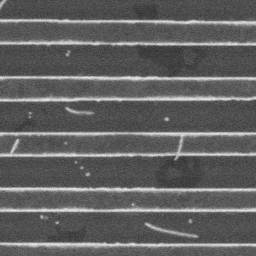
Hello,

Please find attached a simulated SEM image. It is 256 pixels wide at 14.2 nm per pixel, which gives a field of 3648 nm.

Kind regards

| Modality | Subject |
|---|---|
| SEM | lines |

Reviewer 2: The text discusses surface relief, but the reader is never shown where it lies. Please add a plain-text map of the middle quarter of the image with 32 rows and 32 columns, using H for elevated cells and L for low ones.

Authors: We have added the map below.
LLLLLLLLLLLLLLLLLLLLLLLLLLLLLLLL
LLLLLLLLLLLLLLLLLLLLLLLLLLLLLLLL
LLLLLLLLLLLLLLLLLLLLLLLLLLLLLLLL
HHHHLLLLLLLLLLLLLLLLLLLLLLLLLLLL
HHHHHHHHHHHHHHHHHHHHHHHHHHHHHHHH
HHHHHHHHHHHHHHHHHHHHHHHHHHHHHHHH
HHHHHHHHHHHHHHHHHHHHHHHHHHHHHHHH
HHHHHHHHHHHHHHHHHHHHHHHHHHHHHHHH
HHHHHHHHHHHHHHHHHHHHHHHHHHHHHHHH
LLLLLLLLLLLLLLLLLLLLLLLLLLLLLLLL
LLLLLLLLLLLLLLLLLLLLLLLLLLLLLLLL
LLLLLLLLLLLLLLLLLLLLLLLLLLLLLLLL
LLLLLLLLLLLLLLLLLLLLLLLLLLLLLLLL
LLLLLLLLLLLLLLLLLLLLLLLLLLLLLLLL
LLLLLLLLLLLLLLLLLLLLLLLLLLLLLLLL
LLLLLLLLLLLLLLLLLLLLLLLLLLLLLLLL
LLLLLLLLLLLLLLLLLLLLLLLLLLLLLLLL
HHHHHHHHHHHHHHHHHHHHHHLLLLLLHLLL
HHHHHHHHHHHHHHHHHHHHHHHHHHHHHHHH
HHHHHHHHHHHHHHHHHHHHHHHHHHHHHHHH
HHHHHHHHHHHHHHHHHHHHHHHHHHHHHHHH
HHHHHHHHHHHHHHHHHHHHHHHHHHHHHHHH
HHHHHHHHHHHHHHHHHHHHHHHHHHHHHHHH
LLLLLLLLLLLLLLLLLLLLLLLLLLLLLLLL
LLLLLLLLLLLLLLLLLLLLLLLLLLLLLLLL
LLLLLLLLLLLLLLLLLLLLLLLLLLLLLLLL
LLLLLLLLLLLLLLLLLLLLLLLLLLLLLLLL
LLLLLLLLLLLLLLLLLLLLLLLLLLLLLLLL
LLLLLLLLLLLLLLLLLLLLLLLLLLLLLLLL
LLLLLLLLLLLLLLLLLLLLLLLLLLLLLLLL
LLLLLLLLLLLLLLLLLLLLLLLLLLLLLLLL
HHHHHHHHHHHHHHHHHHHHHHHHHHHHHHHH